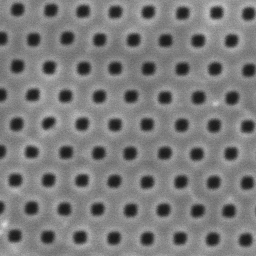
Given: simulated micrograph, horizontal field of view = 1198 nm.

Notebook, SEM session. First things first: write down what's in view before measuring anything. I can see a regular array of holes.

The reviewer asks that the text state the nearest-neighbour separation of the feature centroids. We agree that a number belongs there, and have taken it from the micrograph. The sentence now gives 150 nanometers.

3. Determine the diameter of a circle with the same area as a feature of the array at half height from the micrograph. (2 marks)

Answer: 71.8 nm